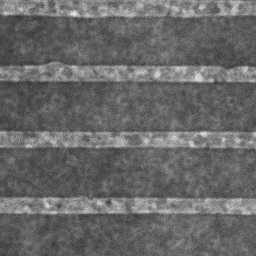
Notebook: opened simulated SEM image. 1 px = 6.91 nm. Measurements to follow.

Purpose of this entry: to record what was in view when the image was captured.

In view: one or a few lines or trenches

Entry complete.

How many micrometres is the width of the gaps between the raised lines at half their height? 0.363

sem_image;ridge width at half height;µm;0.0937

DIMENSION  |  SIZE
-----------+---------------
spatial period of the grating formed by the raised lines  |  0.457 µm